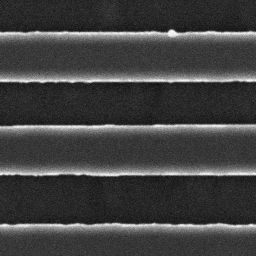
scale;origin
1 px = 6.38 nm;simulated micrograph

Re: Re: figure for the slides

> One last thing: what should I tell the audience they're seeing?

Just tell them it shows lines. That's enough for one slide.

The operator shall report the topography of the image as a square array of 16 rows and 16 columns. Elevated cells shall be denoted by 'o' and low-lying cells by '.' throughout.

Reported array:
................
................
oooooooooooooooo
oooooooooooooooo
oooooooooooooooo
................
................
................
oooooooooooooooo
oooooooooooooooo
oooooooooooooooo
................
................
................
oooooooooooooooo
oooooooooooooooo